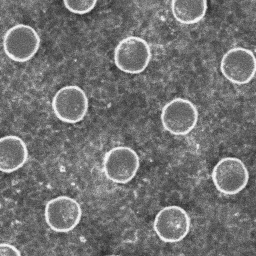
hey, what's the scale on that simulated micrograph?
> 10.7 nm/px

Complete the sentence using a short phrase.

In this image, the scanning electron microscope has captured a regular array of raised bodies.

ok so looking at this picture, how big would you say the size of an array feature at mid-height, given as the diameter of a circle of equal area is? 0.365 microns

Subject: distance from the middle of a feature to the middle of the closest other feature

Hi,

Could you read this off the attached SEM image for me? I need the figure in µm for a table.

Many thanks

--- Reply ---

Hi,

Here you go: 0.812